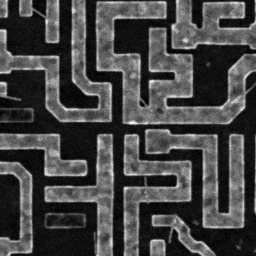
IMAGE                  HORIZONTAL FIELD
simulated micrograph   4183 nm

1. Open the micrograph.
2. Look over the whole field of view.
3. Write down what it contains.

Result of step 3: wiring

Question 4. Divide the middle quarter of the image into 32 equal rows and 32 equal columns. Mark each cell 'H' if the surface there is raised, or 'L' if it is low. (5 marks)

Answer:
LLHHHLLLHHHHHHHHHHHLLHHHHHHHHHHH
LLHHHLLLHHHHHHHHHHHLLHHHHHHHHHHH
LLHHHLLLLLLLLLLHHHHLLLLLLLLLHHHH
LLHHHHLLLLLLLLLHHHHLLLLLLLLLHHHH
LLHHHHHLLLLLLLLHHHHLLHHHHHHHHHHH
LLLHHHHHHHHHLLLHHHHLLHHHHHHHHHHH
LLLLHHHHHHHHLLLHHHHLLHHHHHHHHHHH
LLLLLHHHHHHHLLLHHHHLLHHHHHHHHHHH
LLLLLLLLLHHHLLLHHHHLLHHHHHLLLLLL
LLLLLLLLLHHHLLLHHHHLLHHHHLLLLLLL
LLLLLLLLLHHHLLLHHHHLHHHHHHLLLLLL
HHHHHHHHHHHHLLLHHHHHHHHHHHHHHHHH
HHHHHHHHHHHHLLLHHHHHHHHHHHHHHHHH
HHHHHHHHHHHHLLLHHHHHHHHHHHHHHHHH
LLLLLLLLLLLLLLLHHHHHHHHHHHHHHHHH
LLLLLLLLLLLLLLLLLLLLLLLLLLLLLLLL
LLLLLLLLLLLLLLLLLLLLLHHHHHLLLLLL
LLLLLLLLLLLLLLLLLLLLHHHHHHHLLLLL
LLLLLLLLHHHHLLLHHHHLHHHHHHHHHHHH
LLLLLLLLHHHHLLLHHHHLHHHHHHHHHHHH
LLLLLLLLHHHHLLLHHHHLHHHHHHHHHHHH
LLLLLLLLHHHHLLLHHHHLHHHHHHLLLLLL
LLLLLLLLHHHHLLLHHHHLLLLLLLLLLLLL
LLLLLLLLHHHHLLLHHHHLLLLLLLLLLLLL
HHHHHLLLHHHHLLLHHHHHHHHHHHHHHHHH
HHHHHHLLHHHHLLLHHHHHHHHHHHHHHHHH
HHHHHHLLHHHHLLLHHHHHHHHHHHHHHHHH
HHHHHHLLHHHHLLLHHHHHHHHHHHHHHHHH
LLLLLLLLHHHHLLLLLLLLLLLLLLLLHHHH
LLLLLLLLHHHHLLLLLLLLLLLLLLLLHHHH
LLLLLLLLHHHHLLLLLLLLLLLLLLLLHHHH
HHHHHHHHHHHHLLLHHHHHHHHHHHHHHHHH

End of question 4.